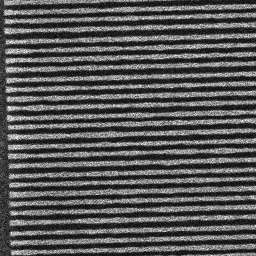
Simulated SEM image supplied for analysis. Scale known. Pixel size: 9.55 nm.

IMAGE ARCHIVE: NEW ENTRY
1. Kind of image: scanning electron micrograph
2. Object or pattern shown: parallel lines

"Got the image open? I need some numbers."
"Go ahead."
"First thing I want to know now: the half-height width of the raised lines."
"41.7 nanometres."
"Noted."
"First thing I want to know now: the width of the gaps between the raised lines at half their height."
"0.0489 micrometres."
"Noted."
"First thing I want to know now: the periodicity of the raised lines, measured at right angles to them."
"91.7 nm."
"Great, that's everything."